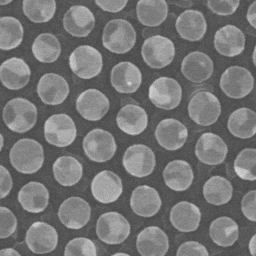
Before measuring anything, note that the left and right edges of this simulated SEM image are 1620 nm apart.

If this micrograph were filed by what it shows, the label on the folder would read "a regular array of raised bodies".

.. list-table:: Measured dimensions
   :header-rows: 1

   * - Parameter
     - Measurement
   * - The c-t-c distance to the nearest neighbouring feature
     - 41.3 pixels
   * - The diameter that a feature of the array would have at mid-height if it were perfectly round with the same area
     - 0.198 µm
